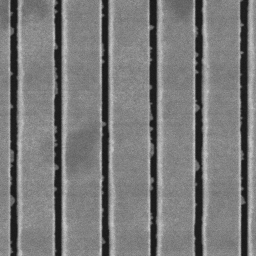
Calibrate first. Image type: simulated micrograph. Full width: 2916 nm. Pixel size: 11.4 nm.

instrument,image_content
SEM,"lines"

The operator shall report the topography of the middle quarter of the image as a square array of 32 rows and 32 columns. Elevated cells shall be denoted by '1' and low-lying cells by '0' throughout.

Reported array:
11111111100111111111100011111111
11111111100111111111100011111111
11111111100111111111100111111111
11111111100111111111100111111111
11111111100111111111100011111111
11111111100111111111100011111111
11111111100111111111100011111111
11111111100111111111100011111111
11111111100111111111100011111111
11111111100111111111100011111111
11111111100111111111100011111111
11111111100111111111100011111111
11111111100111111111100011111111
11111111100111111111100011111111
11111111100111111111100011111111
11111111100111111111100011111111
11111111100111111111100011111111
11111111100111111111100011111111
11111111100111111111100011111111
11111111100111111111100011111111
11111111100111111111100111111111
11111111100111111111100111111111
11111111100111111111100011111111
11111111100111111111100011111111
11111111100111111111100011111111
11111111100111111111100111111111
11111111100111111111100011111111
11111111100111111111100011111111
11111111100111111111100011111111
11111111100111111111100011111111
11111111100111111111100011111111
11111111100111111111100011111111